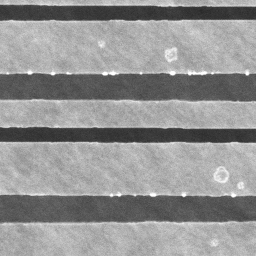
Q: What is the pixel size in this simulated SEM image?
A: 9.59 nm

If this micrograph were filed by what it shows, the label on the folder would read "lines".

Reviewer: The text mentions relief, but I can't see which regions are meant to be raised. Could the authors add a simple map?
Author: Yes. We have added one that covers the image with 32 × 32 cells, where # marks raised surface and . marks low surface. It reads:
################################
................................
................................
################################
################################
################################
################################
################################
################################
................................
................................
................................
................................
################################
################################
################################
................................
................................
################################
################################
################################
################################
################################
################################
................................
................................
................................
................................
################################
################################
################################
################################